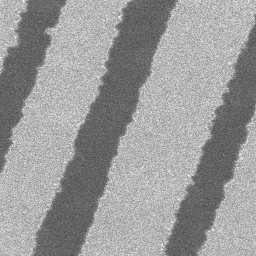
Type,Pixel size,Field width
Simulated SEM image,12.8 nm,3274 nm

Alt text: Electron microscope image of one or a few lines or trenches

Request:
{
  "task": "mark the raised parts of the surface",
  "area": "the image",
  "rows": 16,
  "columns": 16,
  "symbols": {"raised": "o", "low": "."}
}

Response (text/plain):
.ooo....ooo.....
.ooo...oooo.....
.oo....ooo.....o
ooo....ooo.....o
ooo...oooo....oo
oo....ooo.....oo
oo....ooo.....oo
o....ooo.....ooo
o....ooo.....ooo
o....oo.....ooo.
....ooo.....ooo.
....ooo.....oo..
...ooo.....ooo..
...ooo.....ooo..
..oooo.....oo...
..ooo.....ooo...